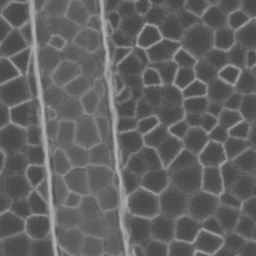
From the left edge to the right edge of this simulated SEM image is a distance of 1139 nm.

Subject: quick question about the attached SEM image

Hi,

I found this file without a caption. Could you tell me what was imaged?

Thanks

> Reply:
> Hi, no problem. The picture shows one or a few lines or trenches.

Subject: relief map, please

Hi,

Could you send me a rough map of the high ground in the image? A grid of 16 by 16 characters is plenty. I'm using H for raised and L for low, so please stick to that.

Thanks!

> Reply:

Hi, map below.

HHLLLLHHHHHHHHHH
HHLLLLHHHHHHHHHH
HHLLLLLHHHHHHHHH
HHLLLLLHHHHHHHHH
HHLLLLLHHHHHHHHH
HHLLLLLHHHHHHHHH
HHHLLLLHHHHHHHHH
HHHLLLLHHHHHHHHH
HHHLLLLHHHHHHHHH
HHHLLLLHHHHHHHHH
HHHLLLLHHHHHHHHH
HHHLLLLLHHHHHHHH
HHHLLLLLHHHHHHHH
HHHLLLLLHHHHHHHH
HHHLLLLLHHHHHHHH
HHHLLLLLHHHHHHHH